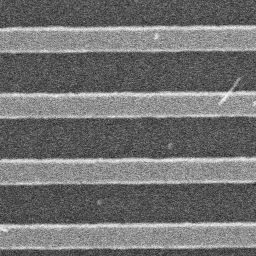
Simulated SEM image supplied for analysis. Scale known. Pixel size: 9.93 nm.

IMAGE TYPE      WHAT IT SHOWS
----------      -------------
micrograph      lines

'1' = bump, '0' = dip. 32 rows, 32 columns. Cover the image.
00000000000000000000000000000000
00000000000000000000000000000000
00000000000000000000000000000000
00101111000011111111111111111111
11111111111111111111111111111111
11111111111111111111111111111111
00000000000000000000000000000000
00000000000000000000000000000000
00000000000000000000000000000000
00000000000000000000000000000000
00000000000000000000000000000000
00000000000000000000000000000000
11111111111111111111111111111111
11111111111111111111111111111111
11111111111111111111111111110001
00000000000000000000000000000000
00000000000000000000000000000000
00000000000000000000000000000000
00000000000000000000000000000000
00000000000000000000000000000000
11111111111111111111111111111111
11111111111111111111111111111111
11111111111111111111111111111111
00000000000000000000000000000000
00000000000000000000000000000000
00000000000000000000000000000000
00000000000000000000000000000000
00000000000000000000000000000000
11111111111111111111111111111111
11111111111111111111111111111111
11111111111111111111111111111111
00000000000000000000000000000000